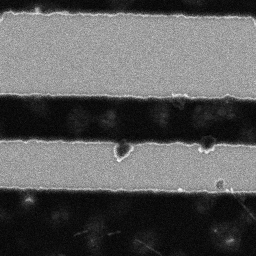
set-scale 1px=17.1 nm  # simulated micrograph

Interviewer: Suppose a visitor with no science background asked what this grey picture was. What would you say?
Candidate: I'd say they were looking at one or a few lines or trenches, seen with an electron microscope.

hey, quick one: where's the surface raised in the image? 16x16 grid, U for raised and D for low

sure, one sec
UUUUUUUUUUUUUUUU
DDDDDDDDDDDDDDDD
DDDDDDDDDDDDDDDD
DDDDDDDDDDDDDDDD
DDDDDDDDDDDDDDDD
DDDDDDDDDDDDDDDD
UUUUUUUUUUUUUUUU
UUUUUUUUUUUUUUUU
UUUUUUUUUUUUUUUU
DDDDDDDUDDDDDDDD
DDDDDDDDDDDDDDDD
DDDDDDDDDDDDDDDD
UUUUUUUUUUUUUUUU
UUUUUUUUUUUUUUUU
UUUUUUUUUUUUUUUU
UUUUUUUUUUUUUUUU